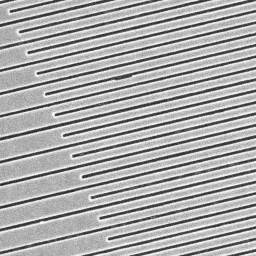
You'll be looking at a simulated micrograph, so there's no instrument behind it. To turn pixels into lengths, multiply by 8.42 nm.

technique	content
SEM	parallel lines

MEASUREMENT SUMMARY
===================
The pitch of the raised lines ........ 93.4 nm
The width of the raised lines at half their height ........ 58.4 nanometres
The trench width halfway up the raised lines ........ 29.7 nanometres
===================